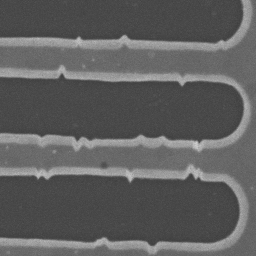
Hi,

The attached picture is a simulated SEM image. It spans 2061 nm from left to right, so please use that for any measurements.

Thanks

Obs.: one or a few lines or trenches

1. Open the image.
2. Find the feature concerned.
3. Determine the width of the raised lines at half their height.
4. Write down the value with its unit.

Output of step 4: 268 nm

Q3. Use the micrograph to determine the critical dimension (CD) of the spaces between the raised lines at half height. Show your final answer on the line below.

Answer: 66.5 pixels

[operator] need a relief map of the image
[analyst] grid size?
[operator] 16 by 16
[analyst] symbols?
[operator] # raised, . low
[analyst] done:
...............#
...............#
...............#
################
################
...............#
...............#
...............#
...............#
################
################
..............##
...............#
...............#
...............#
################